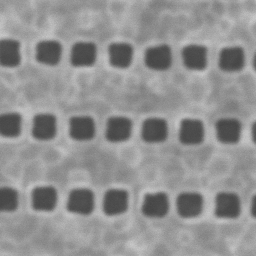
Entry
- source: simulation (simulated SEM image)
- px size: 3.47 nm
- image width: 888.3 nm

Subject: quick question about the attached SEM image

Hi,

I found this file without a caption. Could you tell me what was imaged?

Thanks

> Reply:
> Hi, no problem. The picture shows a regular array of holes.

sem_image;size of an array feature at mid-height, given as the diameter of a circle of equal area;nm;101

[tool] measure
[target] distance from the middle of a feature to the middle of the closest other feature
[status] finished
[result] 126 nanometres